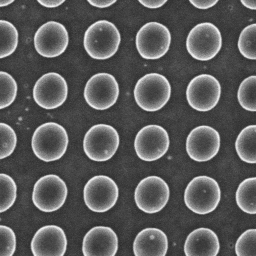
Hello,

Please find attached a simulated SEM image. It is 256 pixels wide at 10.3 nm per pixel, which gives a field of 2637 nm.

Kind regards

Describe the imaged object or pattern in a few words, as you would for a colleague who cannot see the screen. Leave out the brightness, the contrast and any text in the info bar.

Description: a regular array of raised bodies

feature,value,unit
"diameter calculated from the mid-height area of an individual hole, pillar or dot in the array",357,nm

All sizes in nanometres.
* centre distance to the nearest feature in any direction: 524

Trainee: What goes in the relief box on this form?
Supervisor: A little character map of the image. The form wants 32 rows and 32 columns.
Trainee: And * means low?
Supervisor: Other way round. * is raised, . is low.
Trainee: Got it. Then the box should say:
*....**.....**....**....***....*
................................
................................
**...***...***....***...***....*
**..****...****..****...****..**
**..****...****..****..*****..**
*....***...***...****...***...**
................................
................................
*....**.....**....**.....*......
**...***...****..****...***...**
**..****...****..****..****...**
**..****...***...****...***...**
............*.....**....**.....*
................................
......*.........................
**..****...***...****...***...**
**..****...****..****..****...**
**..****...****..****..****...**
*....***...***...***....***...**
................................
................................
*....***...***....**....***....*
**..****...****..****..****...**
**..****...****..****..****...**
*...****...***...****..****...**
........................**.....*
................................
*....**.....*...................
**..****...***...****...***...**
**..****..*****..****..****...**
**..****...***...****..****...**